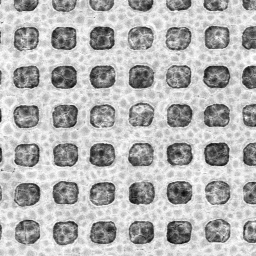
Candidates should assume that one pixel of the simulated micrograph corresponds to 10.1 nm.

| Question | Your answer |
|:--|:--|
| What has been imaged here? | a regular array of holes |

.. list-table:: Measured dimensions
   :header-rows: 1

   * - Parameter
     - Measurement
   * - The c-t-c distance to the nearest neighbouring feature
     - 380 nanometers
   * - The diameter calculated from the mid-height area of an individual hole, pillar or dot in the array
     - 263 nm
